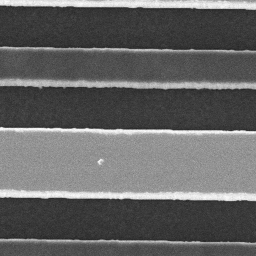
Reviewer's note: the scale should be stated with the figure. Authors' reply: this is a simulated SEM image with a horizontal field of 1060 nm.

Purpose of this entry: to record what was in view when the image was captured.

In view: lines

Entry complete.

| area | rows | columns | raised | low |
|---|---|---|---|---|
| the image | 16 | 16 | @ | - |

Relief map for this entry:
----------------
----------------
----------------
@@@@@@@@@@@@@@@@
@@@@@@@@@@@@@@@@
----------------
----------------
----------------
@@@@@@@@@@@@@@@@
@@@@@@@@@@@@@@@@
@@@@@@@@@@@@@@@@
@@@@@@@@@@@@@@@@
----------------
----------------
----------------
@@@@@@@@@@@@@@@@